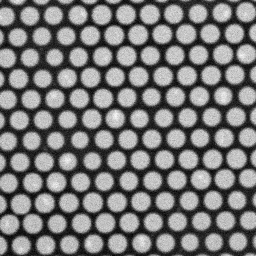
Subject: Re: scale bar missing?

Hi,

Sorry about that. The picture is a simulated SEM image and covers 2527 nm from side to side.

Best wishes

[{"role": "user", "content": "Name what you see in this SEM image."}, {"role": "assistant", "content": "an array of small figures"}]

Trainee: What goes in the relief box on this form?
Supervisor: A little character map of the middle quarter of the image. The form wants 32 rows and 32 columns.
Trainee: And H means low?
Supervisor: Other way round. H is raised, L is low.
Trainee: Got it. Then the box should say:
LLLLLLLLLLLLLLLLLLLLLLLLLLLLLLLL
HHLLLHHHLLLLHHLLLHHHLLLHHHLLLHHH
HHHLHHHHHLLHHHHLLHHHHLLHHHHLLHHH
HHHLHHHHHLLHHHHLHHHHHLHHHHHLLHHH
HHHLLHHHHLLHHHHLLHHHHLLHHHHLLHHH
HHLLLLHHLLLLLLLLLLLLLLLLLLLLLLLL
LLLHHLLLLHHLLLLHHLLLLHHLLLHHHLLL
LLHHHHLLHHHHLLHHHHLLHHHHLLHHHHLL
LLHHHHLLHHHHLLHHHHLLHHHHLLHHHHLL
LLHHHHLLHHHHLLHHHHLLHHHHLLHHHHLL
LLLHHLLLHHHLLLLHLLLLLLLLLLLLLLLL
LLLLLLHHLLLLLLLLLLLLLLLLLLLLLLHH
HHLLLHHHHLLHHHHLLHHHHLLHHHHLLHHH
HHHLLHHHHLLHHHHLLHHHHLLHHHHLLHHH
HHHLLHHHHLLHHHHLLHHHHLLHHHHLLHHH
HHLLLHHHLLLHHHLLLLHHLLLLHHLLLLHL
LLLLLLLLLLLLLLLLLLLLLLLLLLLLLLLL
LLLHHLLLHHHHLLHHHHLLHHHHLLHHHHLL
LLHHHHLLHHHHLLHHHHLLHHHHLLHHHHLL
LLHHHHLLHHHHLLHHHHLLHHHHLLHHHHLL
LLLHHLLLLHHLLLHHHHLLLHHLLLLHHLLL
LLLLLLLLLLLLLLLLLLLLLLLLLLLLLLLL
HHLLLLHHLLLLHHHLLHHHHLLHHHHLLHHH
HHHLLHHHHLLHHHHLLHHHHLLHHHHLLHHH
HHHLLHHHHLLHHHHLLHHHHLLHHHHLLHHH
HHHLLHHHHLLHHHHLLHHHHLLLHHHLLLHH
LLLLLLLLLLLLLLLLLLLLLLLLLLLLLLLL
LLLHHLLLLHHLLLLHHLLLLHHLLLLHHHLL
LLHHHHLLHHHHLLHHHHLLHHHHLLHHHHLL
LLHHHHLLHHHHLLHHHHLLHHHHLLHHHHLL
LLHHHHLLHHHHLLHHHHLLHHHHLLLHHHLL
LLLHHLLLLHHLLLLLLLLLLLLLLLLLLLLL